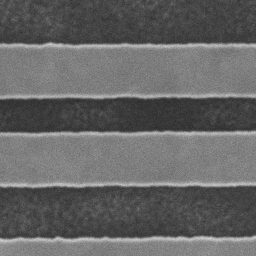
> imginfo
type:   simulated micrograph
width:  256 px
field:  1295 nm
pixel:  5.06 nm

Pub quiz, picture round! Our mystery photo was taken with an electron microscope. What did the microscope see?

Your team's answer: lines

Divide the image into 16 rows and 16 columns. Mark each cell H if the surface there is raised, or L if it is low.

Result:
LLLLLLLLLLLLLLLL
LLLLLLLLLLLLLLLL
LLLLLLLLLLLLLLLL
HHHHHHHHHHHHHHHH
HHHHHHHHHHHHHHHH
HHHHHHHHHHHHHHHH
LLLLLLLLLLLLLLLL
LLLLLLLLLLLLLLLL
HHHHHHHHHHHHHHHH
HHHHHHHHHHHHHHHH
HHHHHHHHHHHHHHHH
HHHHHHHHHHHHHHHH
LLLLLLLLLLLLLLLL
LLLLLLLLLLLLLLLL
LLLLLLLLLLLLLLLL
HHHHHHHHHHHHHHHH